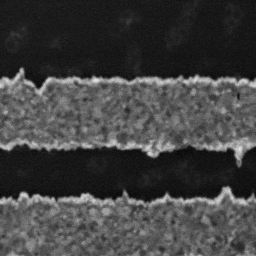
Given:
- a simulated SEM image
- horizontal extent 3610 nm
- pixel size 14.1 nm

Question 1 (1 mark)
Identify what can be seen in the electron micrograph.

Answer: one or a few lines or trenches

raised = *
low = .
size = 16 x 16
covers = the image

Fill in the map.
................
................
................
................
................
****************
****************
****************
****************
................
................
................
***.**.*..*.*.*.
****************
****************
****************